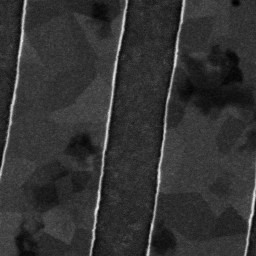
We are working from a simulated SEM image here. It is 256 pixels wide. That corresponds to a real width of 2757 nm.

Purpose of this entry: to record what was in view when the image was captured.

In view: one or a few lines or trenches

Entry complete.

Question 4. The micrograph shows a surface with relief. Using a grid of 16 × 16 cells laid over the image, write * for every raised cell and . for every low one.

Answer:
..******...*****
.*******...*****
.*******...*****
.******....*****
.******....*****
.******....*****
.******...******
.******...******
*******...******
*******...******
******....******
******....******
******....******
******....******
******...*******
******...******.